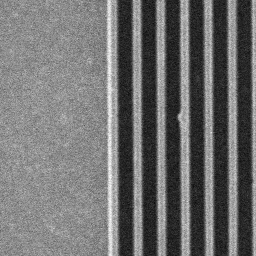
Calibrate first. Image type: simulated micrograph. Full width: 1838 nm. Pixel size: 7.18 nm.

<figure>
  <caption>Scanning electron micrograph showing parallel lines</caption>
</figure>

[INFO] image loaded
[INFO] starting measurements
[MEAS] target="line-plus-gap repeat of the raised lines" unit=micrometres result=0.171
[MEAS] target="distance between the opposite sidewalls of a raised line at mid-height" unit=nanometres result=61.9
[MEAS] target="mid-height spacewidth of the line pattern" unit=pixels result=15.5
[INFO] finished